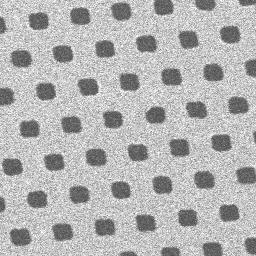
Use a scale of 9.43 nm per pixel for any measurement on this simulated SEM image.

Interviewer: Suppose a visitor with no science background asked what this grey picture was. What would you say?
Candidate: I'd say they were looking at a regular array of holes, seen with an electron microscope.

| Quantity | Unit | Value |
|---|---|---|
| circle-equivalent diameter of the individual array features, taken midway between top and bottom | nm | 185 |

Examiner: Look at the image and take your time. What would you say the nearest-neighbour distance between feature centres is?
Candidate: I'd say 386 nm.